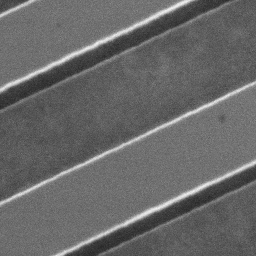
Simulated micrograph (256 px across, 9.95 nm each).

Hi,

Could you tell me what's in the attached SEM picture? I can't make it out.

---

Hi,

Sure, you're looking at lines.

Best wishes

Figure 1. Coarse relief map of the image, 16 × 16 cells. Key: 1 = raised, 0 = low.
0111111111100000
1111111110000000
1111111000000000
1111100000000000
1100000000000000
0000000000000001
0000000000000111
0000000000011111
0000000001111111
0000000111111111
0000011111111110
0011111111111000
1111111111100000
1111111110000000
1111111000000000
1111100000000000